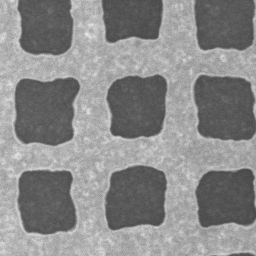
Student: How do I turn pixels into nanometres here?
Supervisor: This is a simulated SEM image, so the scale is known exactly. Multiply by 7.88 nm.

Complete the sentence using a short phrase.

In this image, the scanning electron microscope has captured holes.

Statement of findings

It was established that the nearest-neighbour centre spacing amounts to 711 nm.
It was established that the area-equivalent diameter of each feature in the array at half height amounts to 517 nm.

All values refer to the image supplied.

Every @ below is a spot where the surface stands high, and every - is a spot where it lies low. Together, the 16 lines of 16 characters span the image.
@---@@----@@----
@----@----@@----
@----@@-@@@@----
@@@@@@@@@@@@@@@@
@@@@@@@@@@@@@@@@
@----@@---@@----
@----@@---@@----
@----@@---@@----
@----@@---@@@---
@@@@@@@@@@@@@@@@
@@@@@@@@--@@@@@@
@---@@@---@@----
@----@@---@@----
@----@@---@@----
@@--@@@@@@@@@@@@
@@@@@@@@@@@@@@@@